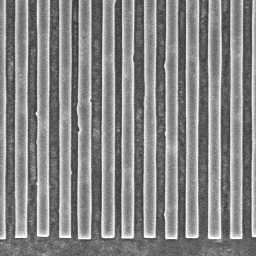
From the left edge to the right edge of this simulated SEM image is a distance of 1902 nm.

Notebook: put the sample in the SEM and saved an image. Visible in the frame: parallel lines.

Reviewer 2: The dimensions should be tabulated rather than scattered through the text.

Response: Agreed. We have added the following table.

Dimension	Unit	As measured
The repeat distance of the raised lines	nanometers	160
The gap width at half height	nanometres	77.1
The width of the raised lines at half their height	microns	0.0846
